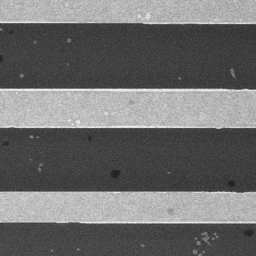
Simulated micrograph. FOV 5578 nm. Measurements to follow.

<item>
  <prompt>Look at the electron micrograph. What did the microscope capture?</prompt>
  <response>lines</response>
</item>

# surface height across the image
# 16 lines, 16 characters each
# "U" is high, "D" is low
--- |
UUUUUUUUUUUUUUUU
DDDDDDDDDDDDDDDD
DDDDDDDDDDDDDDDD
DDDDDDDDDDDDDDDD
DDDDDDDDDDDDDDDD
DDDDDDDDDDDDDDDD
UUUUUUUUUUUUUUUU
UUUUUUUUUUUUUUUU
DDDDDDDDDDDDDDDD
DDDDDDDDDDDDDDDD
DDDDDDDDDDDDDDDD
DDDDDDDDDDDDDDDD
UUUUUUUUUUUUUUUU
UUUUUUUUUUUUUUUU
DDDDDDDDDDDDDDDD
DDDDDDDDDDDDDDDD